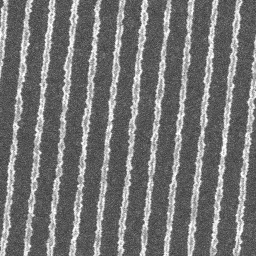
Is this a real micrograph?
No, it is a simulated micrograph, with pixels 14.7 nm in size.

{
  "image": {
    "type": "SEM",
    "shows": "parallel lines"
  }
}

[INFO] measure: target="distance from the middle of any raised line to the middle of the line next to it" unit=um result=0.34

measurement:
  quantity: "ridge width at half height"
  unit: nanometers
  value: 71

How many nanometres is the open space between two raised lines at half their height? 270